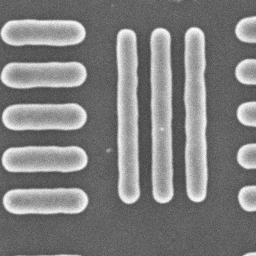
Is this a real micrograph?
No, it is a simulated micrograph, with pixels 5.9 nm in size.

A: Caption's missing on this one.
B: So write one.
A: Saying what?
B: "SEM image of groups of lines, slits or small figures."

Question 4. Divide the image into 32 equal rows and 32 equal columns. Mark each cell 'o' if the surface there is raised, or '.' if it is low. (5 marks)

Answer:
................................
................................
..............................oo
oooooooooo....................oo
ooooooooooo....oo..oo..ooo....oo
.oo...ooo......oo..oo..ooo......
...............oo..oo..ooo......
...............oo..oo..ooo.....o
.oooooooooo....oo..oo..ooo....oo
ooooooooooo....oo..oo..ooo....oo
.ooooooooo.....oo..oo..ooo......
...............oo..oo..ooo......
...............oo..oo..ooo......
.ooooooooo.....oo..oo..ooo....oo
ooooooooooo....oo..oo..ooo....oo
.ooooooooo.....oo..oo..ooo....oo
...............oo..oo..ooo......
...............oo..oo..ooo......
..oooooooo.....oo..oo..ooo....oo
ooooooooooo....oo..oo..ooo....oo
ooooooooooo....oo..oo..ooo....oo
...............oo..oo..ooo......
...............oo..oo..ooo......
...............oo..ooo.ooo....oo
.oooooooooo....oo..ooo..oo....oo
ooooooooooo...................oo
.ooooooooo......................
................................
................................
................................
................................
................................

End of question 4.